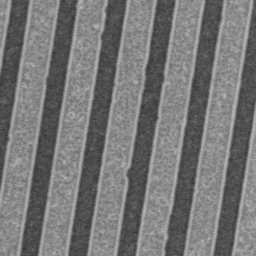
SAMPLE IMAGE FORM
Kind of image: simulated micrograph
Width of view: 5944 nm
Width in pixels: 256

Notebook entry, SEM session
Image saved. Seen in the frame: parallel lines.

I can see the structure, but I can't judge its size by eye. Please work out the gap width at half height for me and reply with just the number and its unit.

488 nanometers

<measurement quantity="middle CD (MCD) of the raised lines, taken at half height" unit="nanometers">634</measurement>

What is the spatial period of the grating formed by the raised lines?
47.8 px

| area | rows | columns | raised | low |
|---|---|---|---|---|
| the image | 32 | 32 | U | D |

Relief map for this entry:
UDDDUUUDDDUUUDDDUUUDDDUUUDDDUUUD
UDDDUUUDDDUUUDDDUUUDDDUUUDDDUUUD
UDDDUUUDDDUUUDDDUUUDDDUUUDDDUUUD
UDDUUUUDDUUUUDDUUUUDDDUUUDDDUUUD
UDDUUUUDDUUUUDDUUUUDDUUUUDDUUUUD
DDDUUUDDDUUUDDDUUUUDDUUUUDDUUUUD
DDDUUUDDDUUUDDDUUUUDDUUUDDDUUUUD
DDDUUUDDDUUUDDDUUUDDDUUUDDDUUUDD
DDDUUUDDDUUUDDDUUUDDDUUUDDDUUUDD
DDUUUUDDUUUUDDDUUUDDDUUUDDDUUUDD
DDUUUUDDUUUUDDUUUUDDDUUUDDUUUUDD
DDUUUUDDUUUUDDUUUUDDUUUUDDUUUUDD
DDUUUDDDUUUDDDUUUDDDUUUDDDUUUUDD
DDUUUDDDUUUDDDUUUDDDUUUDDDUUUDDD
DDUUUDDDUUUDDDUUUDDDUUUDDDUUUDDD
DUUUUDDUUUUDDDUUUDDDUUUDDDUUUDDD
DUUUUDDUUUUDDUUUUDDDUUUDDDUUUDDD
DUUUUDDUUUUDDUUUUDDUUUUDDUUUUDDU
DUUUDDDUUUDDDUUUUDDUUUUDDUUUUDDU
DUUUDDDUUUDDDUUUDDDUUUDDDUUUDDDU
DUUUDDDUUUDDDUUUDDDUUUDDDUUUDDDU
DUUUDDDUUUDDDUUUDDDUUUDDDUUUDDDU
UUUUDDUUUUDDUUUUDDDUUUDDDUUUDDDU
UUUUDDUUUUDDUUUUDDUUUUDDUUUUDDUU
UUUDDDUUUDDDUUUUDDUUUUDDUUUUDDUU
UUUDDDUUUDDDUUUDDDUUUDDDUUUUDDUU
UUUDDDUUUDDDUUUDDDUUUDDDUUUDDDUU
UUUDDDUUUDDDUUUDDDUUUDDDUUUDDDUU
UUUDDUUUUDDDUUUDDDUUUDDDUUUDDDUU
UUUDDUUUUDDUUUUDDUUUUDDUUUUDDUUU
UUUDDUUUUDDUUUUDDUUUUDDUUUUDDUUU
UUDDDUUUDDDUUUDDDUUUDDDUUUUDDUUU